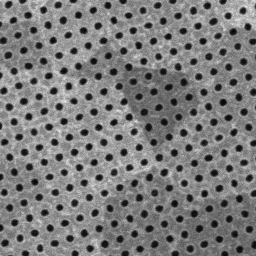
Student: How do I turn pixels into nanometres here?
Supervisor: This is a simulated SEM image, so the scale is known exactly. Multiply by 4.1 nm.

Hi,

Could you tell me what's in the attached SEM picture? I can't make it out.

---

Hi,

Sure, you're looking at a regular array of holes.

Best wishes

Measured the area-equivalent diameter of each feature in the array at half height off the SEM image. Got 33.3 nanometers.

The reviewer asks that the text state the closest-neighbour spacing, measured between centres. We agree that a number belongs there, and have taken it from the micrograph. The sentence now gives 0.0634 µm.